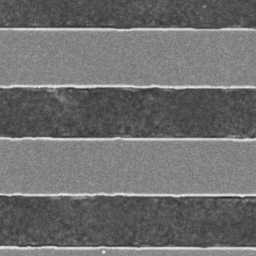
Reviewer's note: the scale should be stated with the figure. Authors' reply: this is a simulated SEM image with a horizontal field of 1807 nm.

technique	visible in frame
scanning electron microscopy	lines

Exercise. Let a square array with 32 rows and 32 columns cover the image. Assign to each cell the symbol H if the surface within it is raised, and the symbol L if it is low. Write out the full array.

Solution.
LLLLLLLLLLLLLLLLLLLLLLLLLLLLLLLL
LLLLLLLLLLLLLLLLLLLLLLLLLLLLLLLL
LLLLLLLLLLLLLLLLLLLLLLLLLLLLLLLL
LLLLLLLLLLLLLLLLLLLLLLLLLLLLLLLL
HHHHHHHHHHHHHHHHHHHHHHHHHHHHHHHH
HHHHHHHHHHHHHHHHHHHHHHHHHHHHHHHH
HHHHHHHHHHHHHHHHHHHHHHHHHHHHHHHH
HHHHHHHHHHHHHHHHHHHHHHHHHHHHHHHH
HHHHHHHHHHHHHHHHHHHHHHHHHHHHHHHH
HHHHHHHHHHHHHHHHHHHHHHHHHHHHHHHH
HHHHHHHHHHHHHHHHHHHHHHHHHHHHHHHH
LLLLLLLLLLLLLLLLLLLLLLLLLLLLLLLL
LLLLLLLLLLLLLLLLLLLLLLLLLLLLLLLL
LLLLLLLLLLLLLLLLLLLLLLLLLLLLLLLL
LLLLLLLLLLLLLLLLLLLLLLLLLLLLLLLL
LLLLLLLLLLLLLLLLLLLLLLLLLLLLLLLL
LLLLLLLLLLLLLLLLLLLLLLLLLLLLLLLL
HHHHHHHHHHHHHHHHHHHHHHHHHHHHHHHH
HHHHHHHHHHHHHHHHHHHHHHHHHHHHHHHH
HHHHHHHHHHHHHHHHHHHHHHHHHHHHHHHH
HHHHHHHHHHHHHHHHHHHHHHHHHHHHHHHH
HHHHHHHHHHHHHHHHHHHHHHHHHHHHHHHH
HHHHHHHHHHHHHHHHHHHHHHHHHHHHHHHH
HHHHHHHHHHHHHHHHHHHHHHHHHHHHHHHH
LLLLLLLLLLLLLLLLLLLLLLHLLLLLLLLL
LLLLLLLLLLLLLLLLLLLLLLLLLLLLLLLL
LLLLLLLLLLLLLLLLLLLLLLLLLLLLLLLL
LLLLLLLLLLLLLLLLLLLLLLLLLLLLLLLL
LLLLLLLLLLLLLLLLLLLLLLLLLLLLLLLL
LLLLLLLLLLLLLLLLLLLLLLLLLLLLLLLL
LLLLLLLLLLLLLLLLLLLLLLLLLLLLLLLL
HHHHHHHHHHHHHHHHHHHHHHHHHHHHHHHH